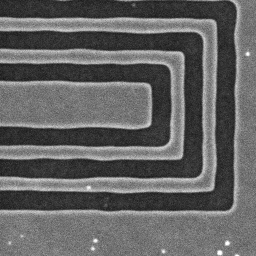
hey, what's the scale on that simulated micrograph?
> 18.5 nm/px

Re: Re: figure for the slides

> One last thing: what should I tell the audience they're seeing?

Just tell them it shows groups of lines, slits or small figures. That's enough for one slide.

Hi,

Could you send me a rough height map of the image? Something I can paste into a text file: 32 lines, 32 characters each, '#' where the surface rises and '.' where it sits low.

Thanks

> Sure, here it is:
.............................###
..............................##
###########################...##
###########################..###
.........................##..###
.........................##..###
#######################..##..###
#######################..##...##
.....................##..##...##
.....................##..##..###
##################...##..##..###
###################..##..##..###
###################..##..##..###
###################..##..##..###
###################..##..##..###
###################..##..##..###
.....................##..##..###
.....................##..##..###
#######################..##..###
#######################..##..###
.........................##..###
.........................##..###
###########################..###
###########################..###
.............................###
.............................###
################################
################################
################################
################################
################################
################################